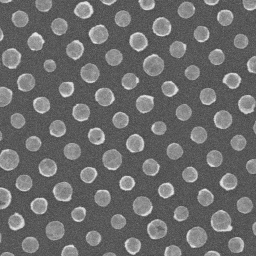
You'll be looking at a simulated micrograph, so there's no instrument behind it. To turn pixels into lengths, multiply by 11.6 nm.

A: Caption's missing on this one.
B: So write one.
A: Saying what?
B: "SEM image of a regular array of raised bodies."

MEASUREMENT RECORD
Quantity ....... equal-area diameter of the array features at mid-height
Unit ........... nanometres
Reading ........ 186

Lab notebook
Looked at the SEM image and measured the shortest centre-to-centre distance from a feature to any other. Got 0.32 micrometres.